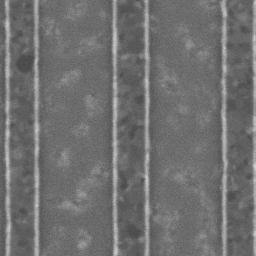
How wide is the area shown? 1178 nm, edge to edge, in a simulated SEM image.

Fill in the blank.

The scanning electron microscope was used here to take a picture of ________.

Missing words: one or a few lines or trenches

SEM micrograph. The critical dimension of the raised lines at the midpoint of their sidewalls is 32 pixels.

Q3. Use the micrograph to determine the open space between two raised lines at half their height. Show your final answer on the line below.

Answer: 353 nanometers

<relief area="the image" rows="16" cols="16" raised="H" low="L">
HHLLLLLHHLLLLLHH
HHLLLLLHHLLLLLHH
HHLLLLLHHLLLLLHH
HHLLLLLHHLLLLLHH
HHLLLLLHHLLLLLHH
HHLLLLLHHLLLLLHH
HHLLLLLHHLLLLLHH
HHLLLLLHHLLLLLHH
HHLLLLLHHLLLLLHH
HHLLLLLHHLLLLLHH
HHLLLLLHHLLLLLHH
HHLLLLLHHLLLLLHH
HHLLLLLHHLLLLLHH
LHLLLLLHHLLLLLHH
LHLLLLLHHLLLLLHH
HHLLLLLHHLLLLLHH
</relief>